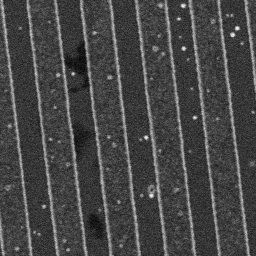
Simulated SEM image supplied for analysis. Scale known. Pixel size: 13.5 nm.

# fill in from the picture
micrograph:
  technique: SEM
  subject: lines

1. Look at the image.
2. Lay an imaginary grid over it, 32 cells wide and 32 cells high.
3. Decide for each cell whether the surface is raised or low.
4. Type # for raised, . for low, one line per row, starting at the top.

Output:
...####...####...####...###....#
....###...####...####...###....#
#...###...####...####...####...#
#...###...####...####...####...#
#...####...###...####...####...#
#...####...###....###...####...#
#...####...####...###....###...#
#...####...####...####...###....
#...####...####...####...###....
#....###...####...####...###....
#....###...####...####...####...
##...###...####...####...####...
##...###....###...####...####...
##...####...###...####...####...
##...####...###....###...####...
##...####...####...###...####...
##...####...####...####...###...
##...####...####...####...###...
##...####...####...####...###...
###...###...####...####...####..
###...###....###...####...####..
###...###....###....###...####..
###...####...###....###...####..
###...####...###....###...####..
###...####...####...####...###..
###...####...####...####...###..
###...####...####...####...###..
###....###...####...####...####.
####...###...####...####...####.
####...###....###...####...####.
####...####...###....###...####.
####...####...###....###...####.